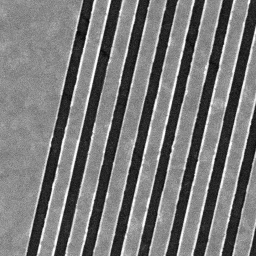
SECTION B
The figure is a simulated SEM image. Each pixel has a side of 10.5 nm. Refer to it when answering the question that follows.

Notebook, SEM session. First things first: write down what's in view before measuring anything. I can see parallel lines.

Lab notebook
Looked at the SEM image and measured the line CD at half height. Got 161 nm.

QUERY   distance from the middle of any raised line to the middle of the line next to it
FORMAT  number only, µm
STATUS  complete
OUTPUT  0.287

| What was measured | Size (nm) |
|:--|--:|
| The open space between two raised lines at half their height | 121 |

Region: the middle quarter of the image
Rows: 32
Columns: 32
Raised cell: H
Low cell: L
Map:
HLLLHHHHLLLHHHHLLLHHHHLLLHHHHLLL
HLLLHHHHLLLHHHHLLLHHHHLLLHHHHLLL
HLLLHHHLLLLHHHLLLHHHHHLLLHHHLLLH
LLLHHHHLLLHHHHLLLHHHHLLLHHHHLLLH
LLLHHHHLLLHHHHLLLHHHHLLLHHHHLLLH
LLLHHHHLLLHHHHLLLHHHHLLLHHHHLLLH
LLLHHHLLLLHHHHLLLHHHHLLLHHHLLLHH
LLHHHHLLLHHHHLLLHHHHLLLHHHHLLLHH
LLHHHHLLLHHHHLLLHHHHLLLHHHHLLLHH
LLHHHHLLLHHHHLLLHHHHLLLHHHHLLLHH
LLHHHHLLLHHHHLLLHHHHLLLHHHHLLLHH
LLHHHLLLHHHHLLLHHHHHLLLHHHLLLHHH
LHHHHLLLHHHHLLLHHHHLLLHHHHLLLHHH
LHHHHLLLHHHHLLLHHHHLLLHHHHLLLHHH
LHHHHLLLHHHHLLLHHHHLLLHHHHLLLHHH
LHHHLLLHHHHHLLLHHHHLLLHHHLLLHHHH
HHHHLLLHHHHLLLHHHHLLLHHHHLLLHHHH
HHHHLLLHHHHLLLHHHHLLLHHHHLLLHHHH
HHHHLLLHHHHLLLHHHHLLLHHHHLLLHHHH
HHHHLLLHHHHLLLHHHHLLLHHHHLLLHHHH
HHHLLLLHHHLLLHHHHHLLLHHHLLLHHHHL
HHHLLLHHHHLLLHHHHLLLHHHHLLLHHHHL
HHHLLLHHHHLLLHHHHLLLHHHHLLLHHHHL
HHHLLLHHHHLLLHHHHLLLHHHHLLLHHHHL
HHLLLLHHHHLLLHHHHLLLHHHLLLHHHHHL
HHLLLHHHHLLLHHHHLLLHHHHLLLHHHHLL
HHLLLHHHHLLLHHHHLLLHHHHLLLHHHHLL
HHLLLHHHHLLLHHHHLLLHHHHLLLHHHHLL
HHLLLHHHHLLLHHHHLLLHHHHLLLHHHHLL
HLLLLHHHLLLHHHHLLLHHHHLLLHHHHLLL
HLLLHHHHLLLHHHHLLLHHHHLLLHHHHLLL
HLLLHHHHLLLHHHHLLLHHHHLLLHHHHLLL